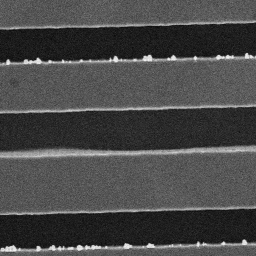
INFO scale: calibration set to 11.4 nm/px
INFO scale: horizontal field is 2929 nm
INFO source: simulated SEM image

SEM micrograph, lines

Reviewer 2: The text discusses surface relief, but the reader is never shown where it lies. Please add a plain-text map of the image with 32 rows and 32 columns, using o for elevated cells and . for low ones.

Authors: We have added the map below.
oooooooooooooooooooooooooooooooo
oooooooooooooooooooooooooooooooo
oooooooooooooooooooooooooooooooo
ooo.............................
................................
................................
................................
...oo.........oooooooooooooooooo
oooooooooooooooooooooooooooooooo
oooooooooooooooooooooooooooooooo
oooooooooooooooooooooooooooooooo
oooooooooooooooooooooooooooooooo
oooooooooooooooooooooooooooooooo
ooooooooooooooooooooo...........
................................
................................
................................
................................
................................
oooooooooooooooooooooooooooooooo
oooooooooooooooooooooooooooooooo
oooooooooooooooooooooooooooooooo
oooooooooooooooooooooooooooooooo
oooooooooooooooooooooooooooooooo
oooooooooooooooooooooooooooooooo
oooooooooooooooooooooooooooooooo
ooooooooooooo...................
................................
................................
................................
...........................oo.oo
oooooooooooooooooooooooooooooooo